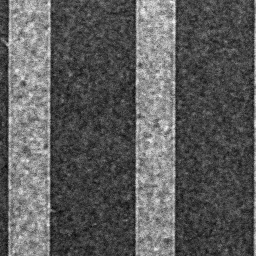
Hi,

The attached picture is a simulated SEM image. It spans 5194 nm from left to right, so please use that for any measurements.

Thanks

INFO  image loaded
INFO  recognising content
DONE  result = one or a few lines or trenches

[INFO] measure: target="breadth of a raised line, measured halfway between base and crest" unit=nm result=778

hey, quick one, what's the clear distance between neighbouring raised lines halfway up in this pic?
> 1.71 micrometres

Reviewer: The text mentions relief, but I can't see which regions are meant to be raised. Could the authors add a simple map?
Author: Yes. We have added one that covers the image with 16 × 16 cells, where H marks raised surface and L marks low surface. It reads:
LHHLLLLLLHHLLLLL
LHHLLLLLLHHLLLLL
LHHLLLLLLHHLLLLL
LHHLLLLLLHHLLLLL
LHHLLLLLLHHLLLLL
LHHLLLLLLHHLLLLL
LHHLLLLLLHHLLLLL
LHHLLLLLLHHLLLLL
LHHLLLLLLHHLLLLL
LHHLLLLLLHHLLLLL
LHHLLLLLLHHLLLLL
LHHLLLLLLHHLLLLL
LHHLLLLLLHHLLLLL
LHHLLLLLLHHLLLLL
LHHLLLLLLHHLLLLL
LHHLLLLLLHHLLLLL